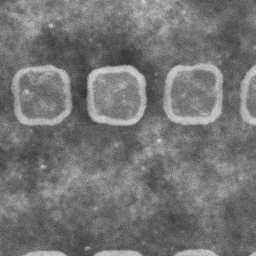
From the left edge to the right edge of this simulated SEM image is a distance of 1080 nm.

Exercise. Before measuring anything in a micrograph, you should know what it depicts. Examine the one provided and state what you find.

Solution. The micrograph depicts raised bodies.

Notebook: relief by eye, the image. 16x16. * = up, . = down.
................
................
................
................
.***..**...***..
.***..***.****.*
.***..***.****.*
..**..**...**...
................
................
................
................
................
................
................
................